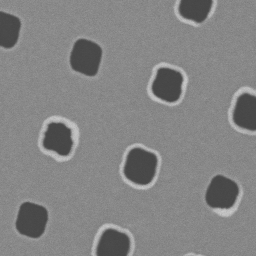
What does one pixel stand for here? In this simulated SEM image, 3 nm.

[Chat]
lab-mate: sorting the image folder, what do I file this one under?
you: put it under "holes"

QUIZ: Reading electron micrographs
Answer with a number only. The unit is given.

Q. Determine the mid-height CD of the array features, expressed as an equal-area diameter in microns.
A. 0.0991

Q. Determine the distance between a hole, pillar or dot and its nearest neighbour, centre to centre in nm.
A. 257